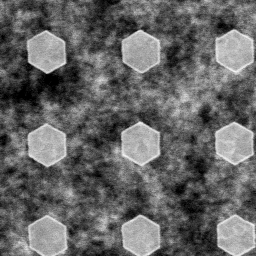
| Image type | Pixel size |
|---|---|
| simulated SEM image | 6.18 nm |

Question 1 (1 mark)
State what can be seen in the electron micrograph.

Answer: raised bodies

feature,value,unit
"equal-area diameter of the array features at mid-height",240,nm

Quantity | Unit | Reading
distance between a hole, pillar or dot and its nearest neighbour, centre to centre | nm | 570